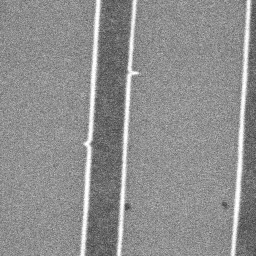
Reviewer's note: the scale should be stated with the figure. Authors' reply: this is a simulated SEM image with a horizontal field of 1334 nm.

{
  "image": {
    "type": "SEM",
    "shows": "one or a few lines or trenches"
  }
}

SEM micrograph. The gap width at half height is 0.597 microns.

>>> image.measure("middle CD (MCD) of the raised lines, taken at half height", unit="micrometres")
0.191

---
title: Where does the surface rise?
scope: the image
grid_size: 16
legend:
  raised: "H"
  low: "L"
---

LLLLLLHHLLLLLLLH
LLLLLLHHLLLLLLLH
LLLLLLHHLLLLLLLH
LLLLLLHHLLLLLLLH
LLLLLLHHLLLLLLLH
LLLLLLHHLLLLLLLH
LLLLLLHHLLLLLLLH
LLLLLLHHLLLLLLLH
LLLLLLHHLLLLLLLH
LLLLLLHHLLLLLLLH
LLLLLHHHLLLLLLLH
LLLLLHHHLLLLLLLH
LLLLLHHHLLLLLLLH
LLLLLHHHLLLLLLLH
LLLLLHHHLLLLLLLH
LLLLLHHLLLLLLLLH